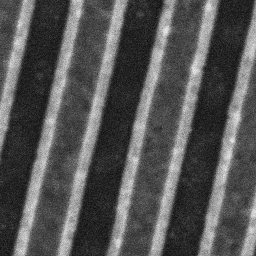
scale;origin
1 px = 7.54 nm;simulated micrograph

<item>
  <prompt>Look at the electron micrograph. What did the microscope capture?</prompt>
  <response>one or a few lines or trenches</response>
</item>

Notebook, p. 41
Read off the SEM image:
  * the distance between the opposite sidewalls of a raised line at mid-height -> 42.9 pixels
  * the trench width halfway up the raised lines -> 355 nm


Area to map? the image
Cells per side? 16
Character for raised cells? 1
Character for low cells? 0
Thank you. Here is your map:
1100011000011000
1000011000111000
1000111000111000
1000111000111000
1000111000110001
1000110001110001
0001110001110001
0001110001110001
0001110001100011
0001100011100011
0011100011100011
0011100011100011
0011100011000011
0011100011000111
0011000111000111
0111000111000111